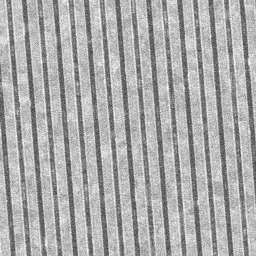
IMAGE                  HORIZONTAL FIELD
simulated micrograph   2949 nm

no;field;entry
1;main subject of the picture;parallel lines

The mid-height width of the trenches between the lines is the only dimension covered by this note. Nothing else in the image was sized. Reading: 66 nm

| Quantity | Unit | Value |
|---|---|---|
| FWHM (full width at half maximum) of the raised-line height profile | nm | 112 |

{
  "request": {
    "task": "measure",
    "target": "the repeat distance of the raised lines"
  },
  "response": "179 nanometres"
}